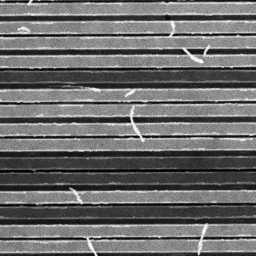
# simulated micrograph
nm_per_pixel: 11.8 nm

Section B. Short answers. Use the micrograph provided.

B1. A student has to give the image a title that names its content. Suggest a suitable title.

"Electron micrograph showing parallel lines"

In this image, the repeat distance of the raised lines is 200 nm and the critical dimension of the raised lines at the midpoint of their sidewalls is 140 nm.